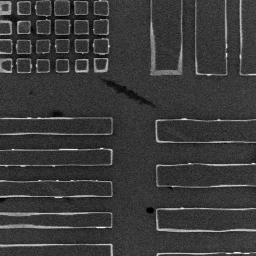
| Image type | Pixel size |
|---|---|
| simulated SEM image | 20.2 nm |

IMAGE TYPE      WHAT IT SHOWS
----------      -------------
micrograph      groups of lines, slits or small figures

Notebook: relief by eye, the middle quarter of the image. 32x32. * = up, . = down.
*..***..***...........*******...
*..***..**............*******...
................................
................................
................................
................................
................................
................................
................................
................................
................................
................................
................................
...*****.***....................
************...........*********
************...........*********
************...........*********
.......................*********
.......................*********
................................
................................
.......****.....................
************....................
************....................
************....................
.......................*********
.......................*********
.......................*********
.......................*********
***********............*********
************.............*******
************....................